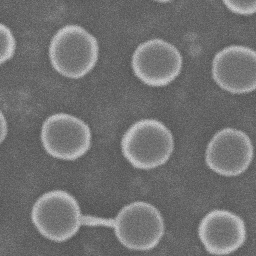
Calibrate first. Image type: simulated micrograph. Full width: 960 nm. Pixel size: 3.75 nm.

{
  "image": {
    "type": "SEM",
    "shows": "raised bodies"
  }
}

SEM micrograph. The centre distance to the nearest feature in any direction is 308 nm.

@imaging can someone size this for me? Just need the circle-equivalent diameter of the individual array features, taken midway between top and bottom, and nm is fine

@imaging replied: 174